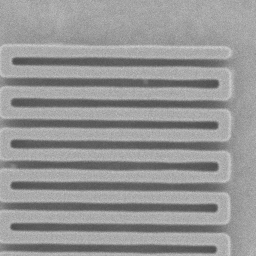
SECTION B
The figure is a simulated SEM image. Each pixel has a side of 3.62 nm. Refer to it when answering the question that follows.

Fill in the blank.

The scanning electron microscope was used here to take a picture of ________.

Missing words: groups of lines, slits or small figures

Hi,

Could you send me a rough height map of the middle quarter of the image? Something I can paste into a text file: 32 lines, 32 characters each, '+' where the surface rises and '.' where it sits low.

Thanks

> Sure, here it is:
................................
++++++++++++++++++++++++++++++++
++++++++++++++++++++++++++++++++
................++++++++++++++++
................................
................................
++++++++++++++++++++++++++++++++
++++++++++++++++++++++++++++++++
++++++++++++++++++++++++++++++++
................................
................................
++++++++++++++++++++++++++++++++
++++++++++++++++++++++++++++++++
++++++++++++++++++++++++++++++++
................................
................................
++++++++++++++++++++++++++++++++
++++++++++++++++++++++++++++++++
++++++++++++++++++++++++++++++++
................................
................................
++++++++++++++++++++............
++++++++++++++++++++++++++++++++
++++++++++++++++++++++++++++++++
.........................++++++.
................................
+++.............................
++++++++++++++++++++++++++++++++
++++++++++++++++++++++++++++++++
.................+++++++++++++++
................................
................................